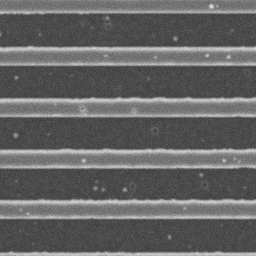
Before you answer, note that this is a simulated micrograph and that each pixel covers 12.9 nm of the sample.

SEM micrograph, lines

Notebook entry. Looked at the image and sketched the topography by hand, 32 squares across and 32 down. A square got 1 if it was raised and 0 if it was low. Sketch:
11111111111111111111111111111111
11111111111111111111111111111111
00000000000000000000000000000000
00000000000000000000000000000000
00000000000000000000000000000000
00000000000000000000000000000000
11111111111111111111111111111111
11111111111111111111111111111111
00000000000000000000000000000000
00000000000000000000000000000000
00000000000000000000000000000000
00000000000000000000000000000000
11111111111111111111111111111111
11111111111111111111111111111111
11111111111111111111111111111111
00000000000000000000000000000000
00000000000000000000000000000000
00000000000000000000000000000000
00000000000000000000000000000000
11111111111111111111111111111111
11111111111111111111111111111111
00000000000000000000000000000000
00000000000000000000000000000000
00000000000000000000000000000000
00000000000000000000000000000000
11111111111111111111111111111111
11111111111111111111111111111111
00000000000000000000000000000000
00000000000000000000000000000000
00000000000000000000000000000000
00000000000000000000000000000000
00000000000000000000000000000000